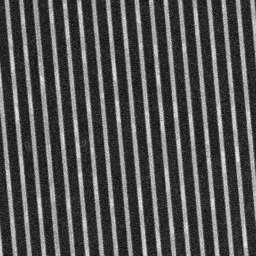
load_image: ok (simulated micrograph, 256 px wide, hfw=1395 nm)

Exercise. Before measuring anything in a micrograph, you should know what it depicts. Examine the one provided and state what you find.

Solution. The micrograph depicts parallel lines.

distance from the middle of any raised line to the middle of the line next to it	0.0784	micrometres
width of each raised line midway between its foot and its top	20.3	nm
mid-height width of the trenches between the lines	61	nm